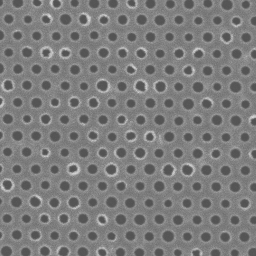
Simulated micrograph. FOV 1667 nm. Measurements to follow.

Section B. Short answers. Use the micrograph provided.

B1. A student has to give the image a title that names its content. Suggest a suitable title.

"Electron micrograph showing a regular array of holes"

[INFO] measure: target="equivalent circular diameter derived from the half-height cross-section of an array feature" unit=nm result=57.4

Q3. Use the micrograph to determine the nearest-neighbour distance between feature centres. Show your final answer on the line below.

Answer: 18.6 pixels